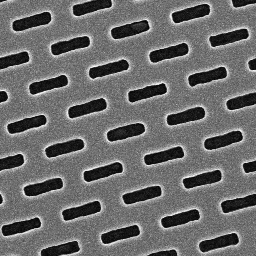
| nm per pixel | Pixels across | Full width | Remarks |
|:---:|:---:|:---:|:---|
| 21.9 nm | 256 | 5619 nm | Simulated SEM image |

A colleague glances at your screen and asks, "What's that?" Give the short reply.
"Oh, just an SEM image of a regular array of holes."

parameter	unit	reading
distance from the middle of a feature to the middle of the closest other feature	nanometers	981